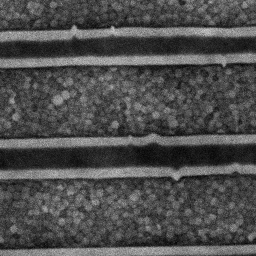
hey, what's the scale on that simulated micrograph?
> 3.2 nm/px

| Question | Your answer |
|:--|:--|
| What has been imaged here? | one or a few lines or trenches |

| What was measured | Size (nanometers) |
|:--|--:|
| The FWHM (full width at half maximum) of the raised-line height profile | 95.8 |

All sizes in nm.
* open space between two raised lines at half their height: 252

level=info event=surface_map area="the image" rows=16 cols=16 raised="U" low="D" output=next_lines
DDDDDDDDDDDDDDDD
DDDDDDDDDDDDDDDD
UUUUUUUUUUUUUUUU
UUUUUUUUUUUUUUUU
DDDDDDDDDDDDDDDD
DDDDDDDDDDDDDDDD
DDDDDDDDDDDDDDDD
DDDDDDDDDDDDDDDD
DDDDDDDDDDDDDDDD
UUUUUUUUUUUUUUUU
UUUUUUUUUUUUUUUU
DDDDDDDDDDDDDDDD
DDDDDDDDDDDDDDDD
DDDDDDDDDDDDDDDD
DDDDDDDDDDDDDDDD
DDDDDDDDDDDDDDDD